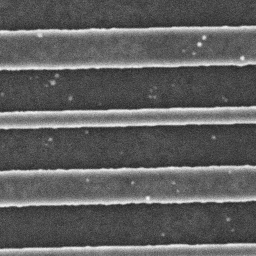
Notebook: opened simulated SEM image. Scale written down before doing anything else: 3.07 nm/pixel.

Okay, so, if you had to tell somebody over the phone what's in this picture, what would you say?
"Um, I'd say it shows lines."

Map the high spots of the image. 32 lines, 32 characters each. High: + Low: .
................................
................................
................................
.....................+++++++++++
++++++++++++++++++++++++++++++++
++++++++++++++++++++++++++++++++
++++++++++++++++++++++++++++++++
++++++++++++++++++++++++++++++++
+++++++++++++..+................
................................
................................
................................
................................
..........................++++++
++++++++++++++++++++++++++++++++
+++++++++++++++++++++++++.......
................................
................................
................................
................................
................................
++++++++++++++++++++++++++++++++
++++++++++++++++++++++++++++++++
++++++++++++++++++++++++++++++++
++++++++++++++++++++++++++++++++
+++++++++++..+..................
................................
................................
................................
................................
................................
++++++++++++++++++++++++++++++++